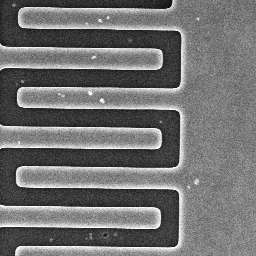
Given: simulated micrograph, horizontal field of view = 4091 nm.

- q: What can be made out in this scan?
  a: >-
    groups of lines, slits or small figures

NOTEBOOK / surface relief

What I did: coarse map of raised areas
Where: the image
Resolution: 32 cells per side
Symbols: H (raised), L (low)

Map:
LLLLLLLLLLLLLLLLLLLLLHHHHHHHHHHH
LLHHHHHHHHHHHHHHHHHHHHHHHHHHHHHH
LLHHHHHHHHHHHHHHHHHHHHHHHHHHHHHH
LLLHHHHHHHHHHHHHHHHHHHHHHHHHHHHH
LLLLLLLLLLLLLLLLLLLLLLLHHHHHHHHH
LLLLLLLLLLLLLLLLLLLLLLLHHHHHHHHH
HHHHHHHHHHHHHHHHHHHHLLLHHHHHHHHH
HHHHHHHHHHHHHHHHHHHHLLLHHHHHHHHH
HLLLLLLLLHHHHHHHHHHHLLLHHHHHHHHH
LLLLLLLLLLLLLLLLLLLLLLLHHHHHHHHH
LLLLLLLLLLLLLLLLLLLLLLHHHHHHHHHH
LLHHHHHHHHHHHHHHHHHHHHHHHHHHHHHH
LLHHHHHHHHHHHHHHHHHHHHHHHHHHHHHH
LLLLLLHHHHHHHHHHHHHHHHHHHHHHHHHH
LLLLLLLLLLLLLLLLLLLLLLHHHHHHHHHH
LLLLLLLLLLLLLLLLLLLLLLLHHHHHHHHH
HHHHHHHHHHHHHHHHHHHHLLLHHHHHHHHH
HHHHHHHHHHHHHHHHHHHHLLLHHHHHHHHH
LLLLLLLLLLHHHHHHHHHHLLHHHHHHHHHH
LLLLLLLLLLLLLLLLLLLLLLHHHHHHHHHH
LLLLLLLLLLLLLLLLLLLLLLHHHHHHHHHH
LLHHHHHHHHHHHHHHHHHHHHHHHHHHHHHH
LLHHHHHHHHHHHHHHHHHHHHHHHHHHHHHH
LLLLLLLLLHHHHHHHHHHHHHHHHHHHHHHH
LLLLLLLLLLLLLLLLLLLLLLHHHHHHHHHH
LLLLLLLLLLLLLLLLLLLLLLHHHHHHHHHH
HHHHHHHHHHHHHHHHHHHHLLHHHHHHHHHH
HHHHHHHHHHHHHHHHHHHHLLHHHHHHHHHH
LLLLLLLLLLLLLLLHHHHHLLHHHHHHHHHH
LLLLLLLLLLLLLLLLLLLLLLHHHHHHHHHH
LLLLLLLLLLLLLLLLLLLLLLHHHHHHHHHH
LLHHHHHHHHHHHHHHHHHHHHHHHHHHHHHH